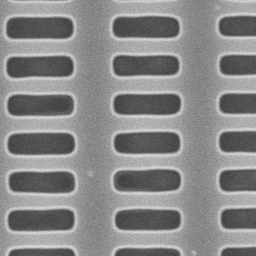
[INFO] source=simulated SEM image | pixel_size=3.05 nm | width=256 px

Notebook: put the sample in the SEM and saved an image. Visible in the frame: groups of lines, slits or small figures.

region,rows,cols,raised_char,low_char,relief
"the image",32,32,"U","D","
UUUUUUUUUUUUUUUUUUUUUUUUUUUUUUUU
UUUUUUUUUUUUUUUUUUUUUUUUUUUUUUUU
UDDDDDDDDUUUUUDDDDDDDDUUUUUDDDDD
UDDDDDDDDUUUUUDDDDDDDDDUUUUDDDDD
UDDDDDDDDUUUUUDDDDDDDDUUUUUUDDDD
UUUUUUUUUUUUUUUUUUUUUUUUUUUUUUUU
UUUUUUUUUUUUUUUUUUUUUUUUUUUUUUUU
UDDDDDDDDUUUUUDDDDDDDDUUUUUDDDDD
UDDDDDDDDUUUUUDDDDDDDDUUUUUDDDDD
UDDDDDDDDUUUUUUDDDDDDUUUUUUUUDDU
UUUUUUUUUUUUUUUUUUUUUUUUUUUUUUUU
UUUUUUUUUUUUUUUUUUUUUUUUUUUUUUUU
UDDDDDDDDUUUUUDDDDDDDDDUUUUDDDDD
UDDDDDDDDUUUUUDDDDDDDDDUUUUDDDDD
UUDDDDDDUUUUUUUUDDDDDUUUUUUUUUUU
UUUUUUUUUUUUUUUUUUUUUUUUUUUUUUUU
UUUUUDDUUUUUUUUUUDDDDUUUUUUUDDDD
UDDDDDDDDUUUUUDDDDDDDDDUUUUDDDDD
UDDDDDDDDUUUUUDDDDDDDDDUUUUDDDDD
UUUUUUUUUUUUUUUUUUUUUUUUUUUUUUUU
UUUUUUUUUUUUUUUUUUUUUUUUUUUUUUUU
UUDDDDDDDUUUUUUDDDDDDDUUUUUUDDDD
UDDDDDDDDUUUUUDDDDDDDDDUUUUDDDDD
UDDDDDDDDUUUUUDDDDDDDDUUUUUUDDDD
UUUUUUUUUUUUUUUUUUUUUUUUUUUUUUUU
UUUUUUUUUUUUUUUUUUUUUUUUUUUUUUUU
UDDDDDDDDUUUUUUDDDDDDDUUUUUUDDDD
UDDDDDDDDUUUUUDDDDDDDDDUUUUUDDDD
UDDDDDDDDUUUUUUDDDDDDDUUUUUUDDDD
UUUUUUUUUUUUUUUUUUUUUUUUUUUUUUUU
UUUUUUUUUUUUUUUUUUUUUUUUUUUUUUUU
UDDDDDDDDUUUUUDDDDDDDDUUUUUUDDDD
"